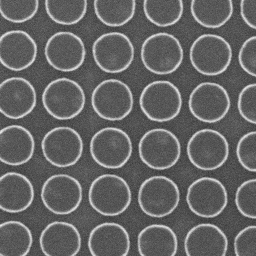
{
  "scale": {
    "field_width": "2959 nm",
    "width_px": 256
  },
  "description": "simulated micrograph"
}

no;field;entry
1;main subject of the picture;a regular array of raised bodies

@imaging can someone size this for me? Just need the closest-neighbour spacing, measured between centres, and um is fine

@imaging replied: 0.549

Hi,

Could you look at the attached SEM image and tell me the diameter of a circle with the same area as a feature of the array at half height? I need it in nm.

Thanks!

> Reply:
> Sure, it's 460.